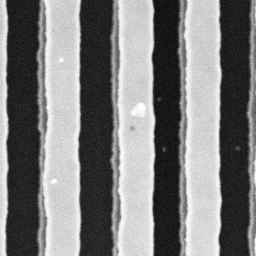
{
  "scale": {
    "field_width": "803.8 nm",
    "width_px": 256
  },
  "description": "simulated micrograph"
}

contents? lines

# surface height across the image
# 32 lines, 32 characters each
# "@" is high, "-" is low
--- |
@----@@@@@----@@@@@----@@@@-----
@----@@@@@----@@@@@----@@@@----@
@----@@@@@----@@@@@----@@@@----@
@----@@@@@----@@@@@----@@@@----@
@----@@@@@----@@@@@----@@@@@---@
@----@@@@@----@@@@@----@@@@@---@
@----@@@@@----@@@@@---@@@@@----@
@----@@@@@----@@@@@----@@@@----@
@----@@@@@----@@@@@----@@@@@---@
@----@@@@@----@@@@@----@@@@@---@
@----@@@@@----@@@@@----@@@@@---@
@----@@@@@----@@@@@----@@@@----@
@----@@@@@----@@@@@----@@@@----@
@----@@@@@----@@@@@----@@@@----@
@----@@@@@----@@@@@----@@@@----@
@----@@@@@----@@@@@----@@@@----@
@----@@@@@----@@@@@----@@@@----@
@----@@@@@----@@@@@----@@@@----@
@----@@@@@----@@@@@----@@@@----@
@----@@@@@----@@@@@----@@@@----@
@----@@@@@----@@@@@----@@@@----@
@----@@@@@----@@@@@----@@@@----@
@----@@@@@----@@@@@----@@@@----@
@----@@@@@----@@@@@----@@@@----@
@----@@@@@----@@@@@----@@@@@---@
@----@@@@@----@@@@@----@@@@@---@
@----@@@@@----@@@@@----@@@@@---@
@----@@@@@----@@@@@----@@@@@---@
@----@@@@@----@@@@@----@@@@@---@
@----@@@@@----@@@@@----@@@@----@
@----@@@@@----@@@@@----@@@@----@
@----@@@@@----@@@@@----@@@@----@